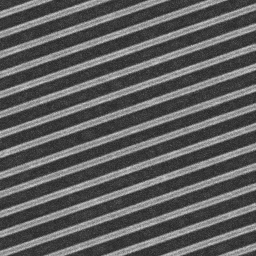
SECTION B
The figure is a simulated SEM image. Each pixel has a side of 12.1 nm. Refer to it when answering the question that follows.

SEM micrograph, parallel lines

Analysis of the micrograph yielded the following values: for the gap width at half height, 164 nanometres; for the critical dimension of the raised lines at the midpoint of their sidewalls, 61.2 nm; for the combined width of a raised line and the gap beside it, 228 nanometres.